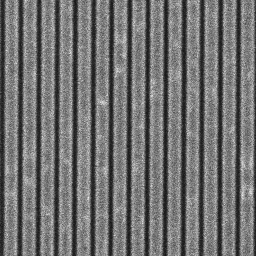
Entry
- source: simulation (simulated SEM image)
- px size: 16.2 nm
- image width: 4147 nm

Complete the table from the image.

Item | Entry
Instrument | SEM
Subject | parallel lines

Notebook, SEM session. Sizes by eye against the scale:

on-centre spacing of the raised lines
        294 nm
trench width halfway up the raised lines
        93.1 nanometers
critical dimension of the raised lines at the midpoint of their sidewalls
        202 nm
